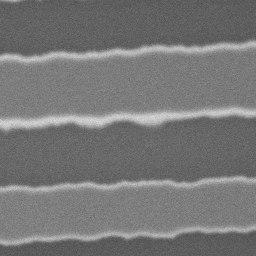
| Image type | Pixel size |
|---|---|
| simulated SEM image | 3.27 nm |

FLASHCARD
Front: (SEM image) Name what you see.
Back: lines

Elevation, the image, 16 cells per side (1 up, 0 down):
0000000000000000
0000000000000000
0000000000000000
0001111111111111
1111111111111111
1111111111111111
1111111111111111
1111011000000000
0000000000000000
0000000000000000
0000000000000000
0000010111111111
1111111111111111
1111111111111111
1111111111110000
0000000000000000